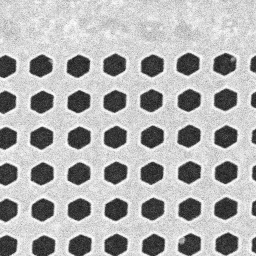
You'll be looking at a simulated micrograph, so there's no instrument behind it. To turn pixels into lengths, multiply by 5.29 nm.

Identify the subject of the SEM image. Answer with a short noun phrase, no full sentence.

a regular array of holes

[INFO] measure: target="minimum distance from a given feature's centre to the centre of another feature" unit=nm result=189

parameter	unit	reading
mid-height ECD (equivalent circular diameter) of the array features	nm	124